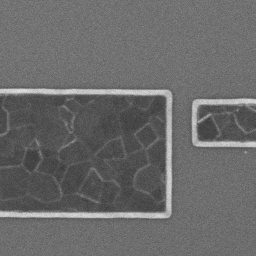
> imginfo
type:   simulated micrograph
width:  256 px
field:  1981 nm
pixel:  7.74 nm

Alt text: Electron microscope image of wiring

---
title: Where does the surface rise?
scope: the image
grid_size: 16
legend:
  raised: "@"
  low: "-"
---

----------------
----------------
----------------
----------------
----------------
----------------
@@@@@@@@@@@--@@@
@@@@@@@@@@@-@@@@
@@@@@@@@@@@-@@@@
@@@@@@@@@@@-----
@@@@@@@@@@@-----
@@@@@@@@@@@-----
@@@@@@@@@@@-----
----------------
----------------
----------------